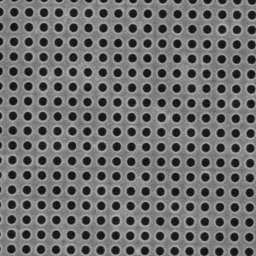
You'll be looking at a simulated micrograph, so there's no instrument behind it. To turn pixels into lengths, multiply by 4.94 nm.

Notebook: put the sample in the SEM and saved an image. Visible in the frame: a regular array of holes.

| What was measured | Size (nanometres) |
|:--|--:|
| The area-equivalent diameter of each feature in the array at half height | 42.8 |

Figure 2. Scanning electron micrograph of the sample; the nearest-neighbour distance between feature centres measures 71.5 nm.